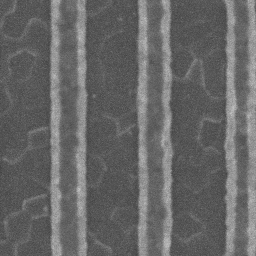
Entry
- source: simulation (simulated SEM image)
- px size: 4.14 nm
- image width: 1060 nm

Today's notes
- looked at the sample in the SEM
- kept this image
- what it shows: one or a few lines or trenches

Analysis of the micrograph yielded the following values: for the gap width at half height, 247 nm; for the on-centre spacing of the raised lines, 0.358 micrometres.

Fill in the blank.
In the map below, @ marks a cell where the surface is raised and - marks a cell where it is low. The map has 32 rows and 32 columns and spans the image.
-------@@@--------@@@--------@@@
-------@@@--------@@@--------@@@
-------@@@--------@@@--------@@@
-------@@@--------@@@--------@@@
-------@@@--------@@@--------@@@
-------@@@--------@@@--------@@@
-------@@@--------@@@--------@@@
-------@@@--------@@@--------@@@
-------@@@--------@@@--------@@@
-------@@@--------@@@--------@@@
-------@@@--------@@@--------@@@
-------@@@--------@@@--------@@@
-------@@@--------@@@--------@@@
-------@@@--------@@@--------@@@
-------@@@--------@@@--------@@@
-------@@@--------@@@--------@@@
-------@@@--------@@@--------@@@
-------@@@--------@@@-------@@@@
-------@@@--------@@@-------@@@@
-------@@@--------@@@--------@@@
-------@@@--------@@@--------@@@
-------@@@--------@@@--------@@@
-------@@@--------@@@--------@@@
-------@@@--------@@@--------@@@
-------@@@--------@@@--------@@@
-------@@@--------@@@--------@@@
-------@@@--------@@@--------@@@
-------@@@--------@@@--------@@@
-------@@@--------@@@--------@@@
-------@@@--------@@@--------@@@
-------@@@--------@@@--------@@@
-------@@@--------@@@--------@@-